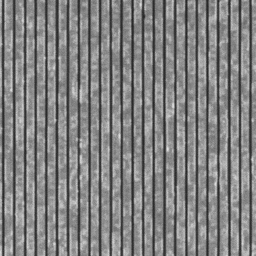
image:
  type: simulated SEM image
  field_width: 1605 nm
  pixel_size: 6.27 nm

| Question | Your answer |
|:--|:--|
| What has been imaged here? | parallel lines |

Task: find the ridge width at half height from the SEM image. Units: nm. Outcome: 47.8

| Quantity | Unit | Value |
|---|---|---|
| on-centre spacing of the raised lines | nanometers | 67.3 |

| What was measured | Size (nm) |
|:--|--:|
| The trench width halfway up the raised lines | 18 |